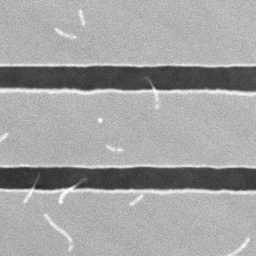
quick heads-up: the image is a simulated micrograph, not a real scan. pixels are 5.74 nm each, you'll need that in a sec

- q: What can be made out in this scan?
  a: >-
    lines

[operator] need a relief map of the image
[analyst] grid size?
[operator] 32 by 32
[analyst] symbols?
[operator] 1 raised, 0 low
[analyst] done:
11111111111111111111111111111111
11111111111111111111111111111111
11111111111111111111111111111111
11111111111111111111111111111111
11111111111111111111111111111111
11111111111111111111111111111111
11111111111111111111111111111111
11111111111111111111111111111111
00000000000000000000000000000000
00000000000000000000000000000000
00000000000000000000000000000000
11111111111111111111111111111111
11111111111111111111111111111111
11111111111111111111111111111111
11111111111111111111111111111111
11111111111111111111111111111111
11111111111111111111111111111111
11111111111111111111111111111111
11111111111111111111111111111111
11111111111111111111111111111111
11111111111111111111111111111111
00000000000000000000000000000000
00000000000000000000000000000000
00000000110000000000000000000000
11111111111111111111111111111111
11111111111111111111111111111111
11111111111111111111111111111111
11111111111111111111111111111111
11111111111111111111111111111111
11111111111111111111111111111111
11111111111111111111111111111111
11111111111111111111111111111111